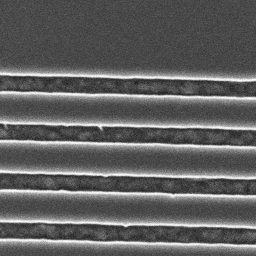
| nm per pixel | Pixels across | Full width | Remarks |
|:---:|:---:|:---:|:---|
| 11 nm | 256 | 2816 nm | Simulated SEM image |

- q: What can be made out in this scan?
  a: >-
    parallel lines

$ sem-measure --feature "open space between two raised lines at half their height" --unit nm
192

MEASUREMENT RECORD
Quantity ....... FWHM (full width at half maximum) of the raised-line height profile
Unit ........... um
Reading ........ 0.344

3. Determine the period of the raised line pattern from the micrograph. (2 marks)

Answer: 0.539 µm